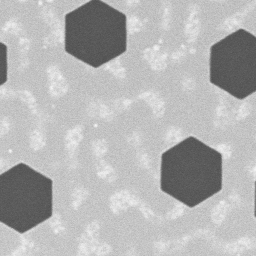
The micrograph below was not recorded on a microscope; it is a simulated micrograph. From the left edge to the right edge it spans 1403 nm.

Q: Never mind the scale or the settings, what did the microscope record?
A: holes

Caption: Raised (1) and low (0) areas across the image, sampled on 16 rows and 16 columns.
1111100111111111
1111000011111111
1111000011111100
1111100111111000
1111111111111000
1111111111111100
1111111111111111
1111111111111111
1111111111111111
1111111111000011
1011111111000011
0001111111000011
0001111111100111
0001111111111111
1111111111111111
1111111111111111